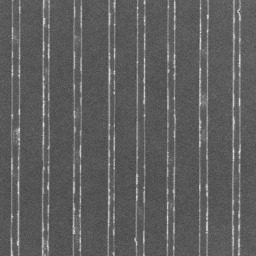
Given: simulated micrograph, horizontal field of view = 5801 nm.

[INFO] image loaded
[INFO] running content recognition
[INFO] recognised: parallel lines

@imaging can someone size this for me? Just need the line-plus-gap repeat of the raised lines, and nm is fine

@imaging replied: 715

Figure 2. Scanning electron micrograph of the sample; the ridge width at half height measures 164 nm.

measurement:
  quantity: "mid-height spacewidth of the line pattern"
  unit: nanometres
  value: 564